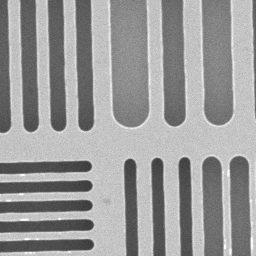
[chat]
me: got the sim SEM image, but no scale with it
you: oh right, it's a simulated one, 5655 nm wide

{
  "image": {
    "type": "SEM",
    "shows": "groups of lines, slits or small figures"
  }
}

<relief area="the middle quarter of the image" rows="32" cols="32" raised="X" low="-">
XXX----XXXXX---------XXXX-----XX
XXX----XXXXX---------XXXX-----XX
XXX----XXXXX---------XXXX-----XX
XXX----XXXXX---------XXXX------X
XXX----XXXXX---------XXXX------X
XXX----XXXXX---------XXXX------X
XXX----XXXXX---------XXXX------X
XXX----XXXXX---------XXXX------X
-XX----XXXXX---------XXXX------X
-XX----XXXXX---------XXXX------X
-XX----XXXXX----------XXX------X
-XX-----XXXX---------XXXX------X
-XX-----XXXX---------XXXX------X
-XX-----XXXXX--------XXXX-----XX
-XX-----XXXXX-------XXXXXX----XX
XXXX---XXXXXXXX----XXXXXXXX-XXXX
XXXX---XXXXXXXXXXXXXXXXXXXXXXXXX
XXXXXXXXXXXXXXXXXXXXXXXXXXXXXXXX
XXXXXXXXXXXXXXXXXXXXXXXXXXXXXXXX
XXXXXXXXXXXXXXXXXXXXXXXXXXXXXXXX
XXXXXXXXXXXXXXXXXXXXXXXXXXXXXXXX
XXXXXXXXXXXXXXXXXXXXXXXXXXXXXXXX
XXXXXXXXXXXXXXXXXXXXXXXXXXXXXXXX
XXXXXXXXXXXXXXXXXXXXXXX-XXXXX--X
------XXXXXXXXX---XXXX---XXXX---
-------XXXXXXXX---XXXX---XXX----
-------XXXXXXXX---XXXX---XXX----
XXXXXXXXXXXXXXX---XXXX---XXXX---
XXXXXXXXXXXXXXX---XXXX---XXXX---
-------XXXXXXXX---XXXX---XXXX---
-------XXXXXXXX---XXXX---XXXX---
-------XXXXXXXX---XXXX---XXXX---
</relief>